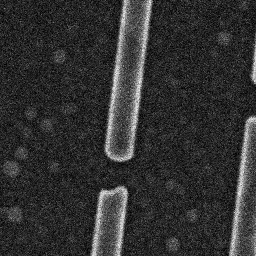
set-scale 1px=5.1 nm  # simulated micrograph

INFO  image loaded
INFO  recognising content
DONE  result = one or a few lines or trenches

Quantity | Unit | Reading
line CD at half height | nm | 130